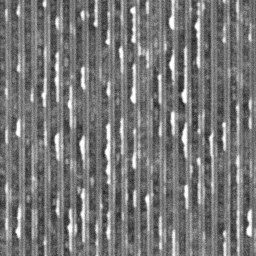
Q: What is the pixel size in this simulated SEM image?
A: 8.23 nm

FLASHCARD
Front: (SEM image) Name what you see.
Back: parallel lines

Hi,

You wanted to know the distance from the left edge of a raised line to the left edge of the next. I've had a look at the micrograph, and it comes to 0.106 microns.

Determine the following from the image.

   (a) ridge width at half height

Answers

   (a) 43.2 nm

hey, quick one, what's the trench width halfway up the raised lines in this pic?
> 64.8 nm